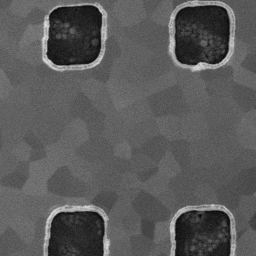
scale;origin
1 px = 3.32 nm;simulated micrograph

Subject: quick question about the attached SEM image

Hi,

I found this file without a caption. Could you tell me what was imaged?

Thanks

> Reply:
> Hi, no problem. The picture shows holes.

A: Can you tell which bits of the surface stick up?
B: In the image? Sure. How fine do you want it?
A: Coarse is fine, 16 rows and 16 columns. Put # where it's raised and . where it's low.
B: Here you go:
####..######..##
###...#####...##
###...#####...##
###...#####...##
################
################
################
################
################
################
################
################
################
####..#####...##
###....####...##
###....####...##